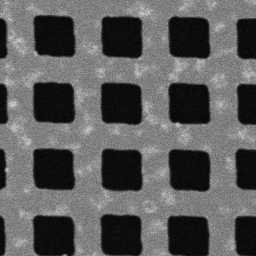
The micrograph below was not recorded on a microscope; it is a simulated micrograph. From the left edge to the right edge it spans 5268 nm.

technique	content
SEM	a regular array of holes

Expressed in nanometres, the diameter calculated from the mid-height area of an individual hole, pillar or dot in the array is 945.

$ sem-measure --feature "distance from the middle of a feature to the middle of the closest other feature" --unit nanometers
1360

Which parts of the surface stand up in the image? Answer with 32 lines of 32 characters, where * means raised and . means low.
********************************
********************************
****.....****....****.....****..
.***.....****.....***.....****..
.***.....****.....***.....****..
.***.....****.....***.....****..
.****....****.....***.....****..
********************************
********************************
********************************
****.....****....****....*****..
.***.....****.....***.....****..
.***.....****.....***.....****..
.***.....****.....***.....****..
.***.....****.....***.....****..
*******.*******..******...****..
********************************
********************************
*************.******************
.***.....****.....***.....***...
.***.....****.....***.....***...
.***.....****.....***.....***...
.***.....****.....***.....***...
*****....****.....****....****..
********************************
********************************
********************************
.***.....****.....***.....***...
.***.....****.....***.....***...
.***.....****.....***.....***...
.***.....****.....***.....***...
.***.....****.....***.....***...